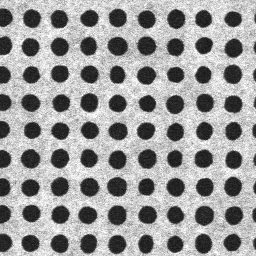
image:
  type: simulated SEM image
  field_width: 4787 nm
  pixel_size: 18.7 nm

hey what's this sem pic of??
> a regular array of holes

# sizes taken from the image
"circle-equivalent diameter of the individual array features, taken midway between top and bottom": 345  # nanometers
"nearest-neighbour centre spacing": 519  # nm